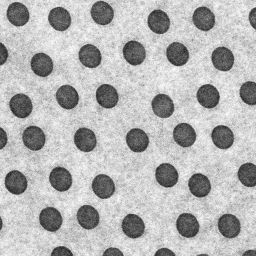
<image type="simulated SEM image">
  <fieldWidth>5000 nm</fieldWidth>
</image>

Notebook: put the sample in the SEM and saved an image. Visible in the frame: a regular array of holes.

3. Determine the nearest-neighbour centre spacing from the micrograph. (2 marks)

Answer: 778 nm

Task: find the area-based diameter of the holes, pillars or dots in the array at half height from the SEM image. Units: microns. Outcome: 0.467